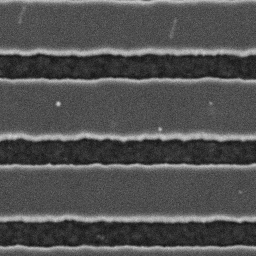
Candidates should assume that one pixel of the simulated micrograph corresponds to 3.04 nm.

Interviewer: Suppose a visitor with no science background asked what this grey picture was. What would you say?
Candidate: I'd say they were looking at lines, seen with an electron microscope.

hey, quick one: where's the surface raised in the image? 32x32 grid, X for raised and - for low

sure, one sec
XXXXXXXXXXXXXXXXXXXXXXXXXXXXXXXX
XXXXXXXXXXXXXXXXXXXXXXXXXXXXXXXX
XXXXXXXXXXXXXXXXXXXXXXXXXXXXXXXX
XXXXXXXXXXXXXXXXXXXXXXXXXXXXXXXX
XXXXXXXXXXXXXXXXXXXXXXXXXXXXXXXX
XXXXXXXXXXXXXXXXXXXXXXXXXXXXXXXX
XXXXXXXXXXXXXXXXXXXXXXXXXXXXXXXX
--------------------------------
--------------------------------
--------------------------------
XXXXXXXXXXXXXXXXXXXXXXXXXXXXXXXX
XXXXXXXXXXXXXXXXXXXXXXXXXXXXXXXX
XXXXXXXXXXXXXXXXXXXXXXXXXXXXXXXX
XXXXXXXXXXXXXXXXXXXXXXXXXXXXXXXX
XXXXXXXXXXXXXXXXXXXXXXXXXXXXXXXX
XXXXXXXXXXXXXXXXXXXXXXXXXXXXXXXX
XXXXXXXXXXXXXXXXXXXXXXXXXXXXXXXX
----X----------X----------------
--------------------------------
--------------------------------
--------------------X-----------
XXXXXXXXXXXXXXXXXXXXXXXXXXXXXXXX
XXXXXXXXXXXXXXXXXXXXXXXXXXXXXXXX
XXXXXXXXXXXXXXXXXXXXXXXXXXXXXXXX
XXXXXXXXXXXXXXXXXXXXXXXXXXXXXXXX
XXXXXXXXXXXXXXXXXXXXXXXXXXXXXXXX
XXXXXXXXXXXXXXXXXXXXXXXXXXXXXXXX
X--XXXXX--XX-XXXXXXXXXXXXXX--XXX
--------------------------------
--------------------------------
--------------------------------
XXXXXXXXXXXXXXXXXXXXXXXXXXXXXXXX